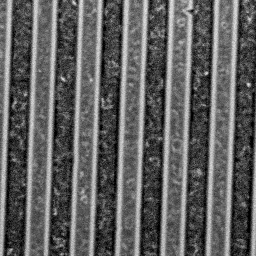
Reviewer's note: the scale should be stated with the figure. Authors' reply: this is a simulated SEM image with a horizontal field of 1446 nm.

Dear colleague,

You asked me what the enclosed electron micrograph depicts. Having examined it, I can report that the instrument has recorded parallel lines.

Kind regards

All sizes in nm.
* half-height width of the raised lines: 106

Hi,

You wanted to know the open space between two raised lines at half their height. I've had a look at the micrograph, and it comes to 149 nm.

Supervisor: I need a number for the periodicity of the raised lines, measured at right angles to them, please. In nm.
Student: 255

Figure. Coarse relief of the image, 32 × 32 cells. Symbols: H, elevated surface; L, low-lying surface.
HLLLLHHLLLHHLLLLHHLLLHHHLLLHHLLL
HLLLHHHLLLHHLLLLHHLLLHHHLLLHHLLL
HLLLHHHLLLHHLLLLHHLLLHHHLLLHHLLL
HLLLHHHLLLHHLLLLHHLLLHHHLLLHHLLL
HLLLHHHLLLHHLLLLHHLLLHHHLLLHHLLL
HLLLHHHLLLHHLLLLHHLLLHHHLLLHHLLL
HLLLHHHLLLHHLLLLHHLLLHHHLLLHHLLL
HLLLHHHLLLHHLLLLHHLLLHHHLLLHHLLL
HLLLHHHLLLHHLLLLHHLLLHHHLLLHHLLL
HLLLHHLLLLHHLLLLHHLLLHHLLLLHHLLL
HLLLHHLLLLHHLLLLHHLLLHHLLLLHHLLL
HLLLHHLLLLHHLLLHHHLLLHHLLLLHHLLL
HLLLHHLLLLHHLLLHHHLLLHHLLLLHHLLL
HLLLHHLLLLHHLLLHHHLLLHHLLLLHHLLL
HLLLHHLLLLHHLLLHHHLLLHHLLLLHHLLL
HLLLHHLLLLHHLLLHHHLLLHHLLLLHHLLL
HLLLHHLLLLHHLLLHHHLLLHHLLLLHHLLL
HLLLHHLLLLHHLLLHHHLLLHHLLLHHHLLL
HLLLHHLLLLHHLLLHHHLLLHHLLLHHHLLL
HLLLHHLLLLHHLLLHHLLLLHHLLLHHHLLL
HLLLHHLLLHHHLLLHHLLLLHHLLLHHHLLL
LLLLHHLLLHHHLLLHHLLLLHHLLLHHHLLL
LLLLHHLLLHHHLLLHHLLLLHHLLLHHHLLL
LLLLHHLLLHHHLLLHHLLLLHHLLLHHHLLL
LLLLHHLLLHHHLLLHHLLLLHHLLLHHHLLL
LLLLHHLLLHHHLLLHHLLLLHHLLLHHHLLL
LLLLHHLLLHHHLLLHHLLLLHHLLLHHHLLL
LLLLHHLLLHHHLLLHHLLLHHHLLLHHHLLL
LLLLHHLLLHHLLLLHHLLLHHHLLLHHLLLL
LLLLHHLLLHHLLLLHHLLLHHHLLLHHLLLL
LLLHHHLLLHHLLLLHHLLLHHHLLLHHLLLL
LLLHHHLLLHHLLLLHHLLLHHHLLLHHLLLL